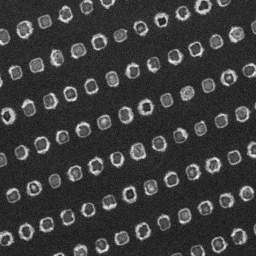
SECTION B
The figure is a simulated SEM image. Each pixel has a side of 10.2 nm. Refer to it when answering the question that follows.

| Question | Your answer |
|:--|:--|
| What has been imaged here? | a regular array of holes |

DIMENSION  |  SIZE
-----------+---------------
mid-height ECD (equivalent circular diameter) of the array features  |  113 nanometres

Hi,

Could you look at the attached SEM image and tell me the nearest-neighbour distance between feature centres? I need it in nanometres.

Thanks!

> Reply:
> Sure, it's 224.